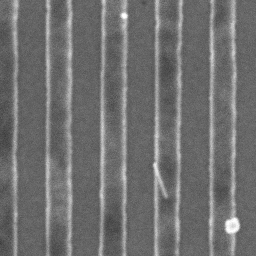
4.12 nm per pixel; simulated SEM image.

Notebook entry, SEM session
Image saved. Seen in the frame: lines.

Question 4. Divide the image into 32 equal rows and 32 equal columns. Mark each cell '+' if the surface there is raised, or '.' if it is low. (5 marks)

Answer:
++....+++....+++....+++...+++...
++....+++....+++....+++...+++...
++....+++....+++....+++...+++...
++....+++....+++....+++...+++...
++....+++....+++....+++...+++...
++....+++....+++....+++...+++...
++....+++....+++....++....+++...
++....+++....+++....+++...+++...
++....+++....+++....+++...+++...
++....+++....+++....+++...+++...
++....+++....+++....+++...+++...
++....+++....+++....+++...+++...
++....+++....+++....+++...+++...
++....+++....+++....+++...+++...
++....+++....+++....++....+++...
++....+++....+++....++....+++...
++....+++....+++....++....+++...
++....+++....+++....++....+++...
++....+++....+++....++....+++...
++....+++....+++....++....+++...
++....+++....+++...+++....+++...
++....+++....+++...+++....+++...
++....+++....+++...+++....+++...
++....+++....+++...+++....+++...
++....+++....+++...+++....+++...
++....+++....+++...+++....+++...
++....+++....+++...+++....+++...
++....+++....+++...+++....++++..
++....+++....+++...+++....++++..
++....+++....+++...+++....+++...
++....+++....+++...+++....+++...
++....+++...++++...+++....+++...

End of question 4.